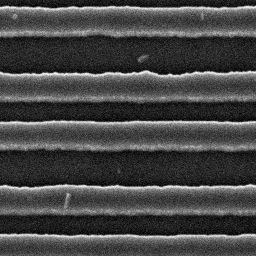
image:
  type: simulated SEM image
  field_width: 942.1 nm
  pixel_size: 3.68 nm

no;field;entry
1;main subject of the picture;lines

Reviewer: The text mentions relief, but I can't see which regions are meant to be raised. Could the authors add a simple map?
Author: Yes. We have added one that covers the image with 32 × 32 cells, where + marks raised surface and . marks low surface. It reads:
................................
++++++++++++++++++++++++++++++++
++++++++++++++++++++++++++++++++
++++++++++++++++++++++++++++++++
................................
................................
................................
................................
................................
++++++++++++++++++++++++++++++++
++++++++++++++++++++++++++++++++
++++++++++++++++++++++++++++++++
.................+..............
................................
................................
++++++++++++++++++++++++++++++++
++++++++++++++++++++++++++++++++
++++++++++++++++++++++++++++++++
...+......++++++.+++++++++.++++.
................................
................................
................................
................................
++++++++++++++++++++++++++++++++
++++++++++++++++++++++++++++++++
++++++++++++++++++++++++++++++++
++++++++++++++++++++++++++++++++
................................
................................
++++++++.++++++++.....+++++++.++
++++++++++++++++++++++++++++++++
++++++++++++++++++++++++++++++++